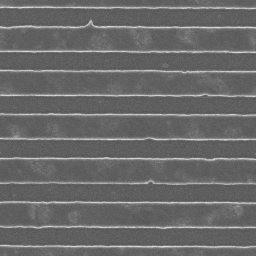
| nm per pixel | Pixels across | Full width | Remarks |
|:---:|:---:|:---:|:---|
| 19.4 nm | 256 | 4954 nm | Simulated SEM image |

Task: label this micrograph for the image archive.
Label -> parallel lines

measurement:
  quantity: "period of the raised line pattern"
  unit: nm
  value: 849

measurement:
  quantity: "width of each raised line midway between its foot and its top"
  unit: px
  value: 24.7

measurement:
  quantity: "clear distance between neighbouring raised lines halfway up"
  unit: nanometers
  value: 370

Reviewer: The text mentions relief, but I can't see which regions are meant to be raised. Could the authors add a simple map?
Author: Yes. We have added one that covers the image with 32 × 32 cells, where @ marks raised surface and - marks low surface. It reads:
@@@@@@@@@@@@@@@@@@@@@@@@@@@@@@@@
--------------------------------
--------------------------------
@@@@@@@@@@@@@@@@@@@@@@@@@--@@@@@
@@@@@@@@@@@@@@@@@@@@@@@@@@@@@@@@
@@@@@@@@@@@@@@@@@@@@@@@@@@@@@@@@
----@------------@--------------
--------------------------------
--------------------------------
@@@@@@@@@@@@@@@@@@@@@@@@@@@@@@@@
@@@@@@@@@@@@@@@@@@@@@@@@@@@@@@@@
@@@@@@@@@@@@@@@@@@@@@@@@@@@@@@@@
--------------------------------
--------------------------------
@@@@@@@@@@@@@@@@@@@@@@@@@@@@@@@@
@@@@@@@@@@@@@@@@@@@@@@@@@@@@@@@@
@@@@@@@@@@@@@@@@@@@@@@@@@@@@@@@@
--------------------------------
--------------------------------
--------------------------------
@@@@@@@@@@@@@@@@@@@@@@@@@@@@@@@@
@@@@@@@@@@@@@@@@@@@@@@@@@@@@@@@@
@@@@@@@@@@@@@@@@@@@@@@@@@@@@@@@@
--------------------------------
--------------------------------
@@@@@@@@@@@@@@@@@@@@@@@@@@@@@@@@
@@@@@@@@@@@@@@@@@@@@@@@@@@@@@@@@
@@@@@@@@@@@@@@@@@@@@@@@@@@@@@@@@
--------------------@-----------
--------------------------------
--------------------------------
@@@@@@@@@@@@@@@@@@@@@@@@@@@@@@@@